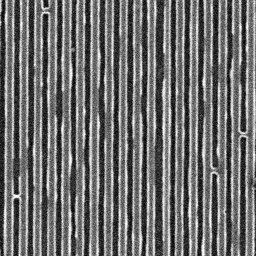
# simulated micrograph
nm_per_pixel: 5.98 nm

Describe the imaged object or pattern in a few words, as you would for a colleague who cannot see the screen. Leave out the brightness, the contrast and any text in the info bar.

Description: parallel lines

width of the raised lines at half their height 51.6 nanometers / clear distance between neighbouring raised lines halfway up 0.0314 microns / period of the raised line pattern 84.9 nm